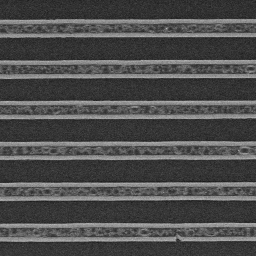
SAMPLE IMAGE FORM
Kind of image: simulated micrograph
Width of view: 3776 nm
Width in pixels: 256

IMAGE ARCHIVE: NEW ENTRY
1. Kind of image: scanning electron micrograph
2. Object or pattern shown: parallel lines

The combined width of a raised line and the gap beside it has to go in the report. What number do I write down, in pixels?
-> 40.8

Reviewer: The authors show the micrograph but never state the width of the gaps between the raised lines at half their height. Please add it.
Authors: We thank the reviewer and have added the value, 0.387 µm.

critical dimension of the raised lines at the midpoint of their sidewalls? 225 nanometres